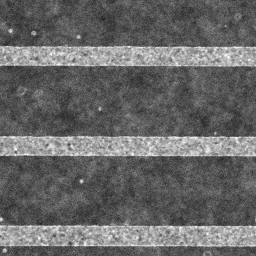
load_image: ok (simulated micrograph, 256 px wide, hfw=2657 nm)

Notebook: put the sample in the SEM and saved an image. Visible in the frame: one or a few lines or trenches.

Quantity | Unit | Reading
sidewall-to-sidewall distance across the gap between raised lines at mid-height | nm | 737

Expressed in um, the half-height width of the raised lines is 0.197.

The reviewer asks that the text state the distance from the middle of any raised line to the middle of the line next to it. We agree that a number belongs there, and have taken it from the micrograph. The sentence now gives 932 nm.